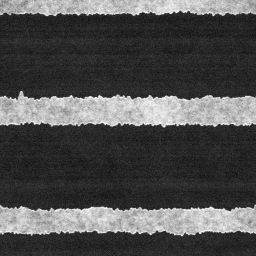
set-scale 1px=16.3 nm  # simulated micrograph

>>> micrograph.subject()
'one or a few lines or trenches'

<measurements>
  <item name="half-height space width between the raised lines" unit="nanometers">1380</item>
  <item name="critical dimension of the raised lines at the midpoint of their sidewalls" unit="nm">403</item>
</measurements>